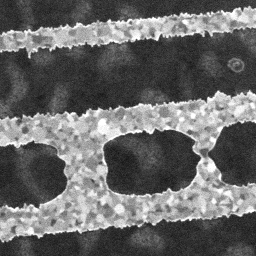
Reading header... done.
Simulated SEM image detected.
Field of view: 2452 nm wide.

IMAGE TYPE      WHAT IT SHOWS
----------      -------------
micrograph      one or a few lines or trenches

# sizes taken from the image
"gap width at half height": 606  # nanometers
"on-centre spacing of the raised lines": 854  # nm